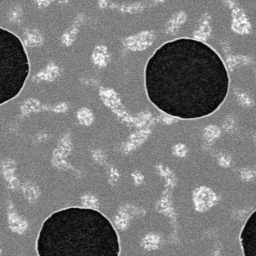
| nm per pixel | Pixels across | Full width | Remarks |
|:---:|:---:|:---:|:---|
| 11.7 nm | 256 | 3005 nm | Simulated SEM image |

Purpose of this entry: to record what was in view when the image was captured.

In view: holes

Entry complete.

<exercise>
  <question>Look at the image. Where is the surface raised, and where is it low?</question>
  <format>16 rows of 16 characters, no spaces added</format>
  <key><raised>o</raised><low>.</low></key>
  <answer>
oooooooooooooooo
oooooooooooooooo
.oooooooooo.oooo
..oooooooo....oo
..ooooooo.....oo
.oooooooo.....oo
oooooooooo....oo
oooooooooooooooo
oooooooooooooooo
oooooooooooooooo
oooooooooooooooo
oooooooooooooooo
oooooooooooooooo
ooo...oooooooooo
ooo....oooooooo.
oo.....oooooooo.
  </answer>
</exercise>